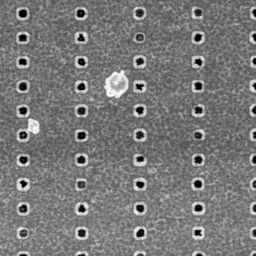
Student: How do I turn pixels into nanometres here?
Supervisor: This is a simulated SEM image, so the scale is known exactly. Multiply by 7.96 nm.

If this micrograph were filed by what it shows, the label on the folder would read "a regular array of holes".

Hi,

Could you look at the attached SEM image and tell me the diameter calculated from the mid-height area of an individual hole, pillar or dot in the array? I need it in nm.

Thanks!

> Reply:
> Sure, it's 66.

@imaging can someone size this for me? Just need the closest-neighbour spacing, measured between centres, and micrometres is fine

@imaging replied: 0.191